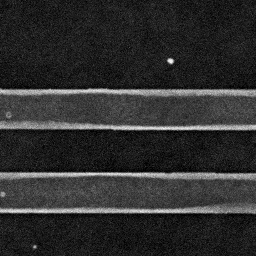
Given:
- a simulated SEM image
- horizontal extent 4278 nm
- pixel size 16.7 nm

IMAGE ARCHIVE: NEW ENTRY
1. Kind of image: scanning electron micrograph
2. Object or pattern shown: lines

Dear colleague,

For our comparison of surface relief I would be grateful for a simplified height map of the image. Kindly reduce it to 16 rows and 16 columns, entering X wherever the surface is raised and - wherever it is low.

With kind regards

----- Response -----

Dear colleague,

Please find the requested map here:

----------------
----------------
----------------
----------------
----------------
----------------
XXXXXXXXXXXXXXXX
XXXXXXXXXXXXXXXX
----------------
----------------
----------------
XXXXXXXXXXXXXXXX
XXXXXXXXXXXXXXXX
----------------
----------------
----------------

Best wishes